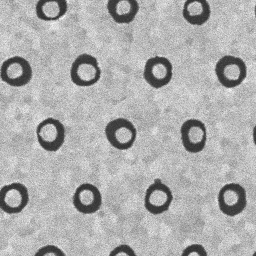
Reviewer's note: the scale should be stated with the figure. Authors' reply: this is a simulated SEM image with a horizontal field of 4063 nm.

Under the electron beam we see a regular array of ring-shaped grooves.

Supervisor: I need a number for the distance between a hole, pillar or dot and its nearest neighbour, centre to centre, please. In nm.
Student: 1130